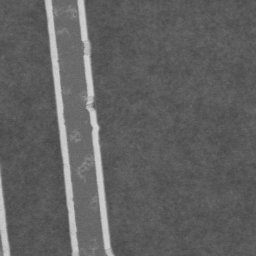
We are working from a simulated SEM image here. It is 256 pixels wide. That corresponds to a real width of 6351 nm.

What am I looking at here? one or a few lines or trenches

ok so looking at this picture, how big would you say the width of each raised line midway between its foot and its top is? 792 nm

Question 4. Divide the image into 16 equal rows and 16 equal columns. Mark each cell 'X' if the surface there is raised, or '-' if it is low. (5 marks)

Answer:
---XX-----------
---XX-----------
---XX-----------
---XX-----------
----XX----------
----XX----------
----XX----------
----XX----------
----XX----------
----XX----------
----XX----------
----XX----------
----XX----------
----XXX---------
-----XX---------
-----XX---------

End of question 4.